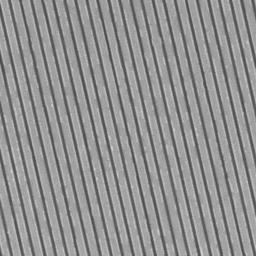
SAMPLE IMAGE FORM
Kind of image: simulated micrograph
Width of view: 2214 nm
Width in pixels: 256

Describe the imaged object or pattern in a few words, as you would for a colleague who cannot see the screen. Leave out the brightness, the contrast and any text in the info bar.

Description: parallel lines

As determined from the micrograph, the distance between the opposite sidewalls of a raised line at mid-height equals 0.0654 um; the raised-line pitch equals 93.4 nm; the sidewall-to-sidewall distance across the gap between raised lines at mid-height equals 2.8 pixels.